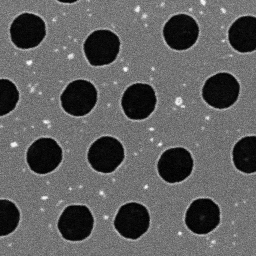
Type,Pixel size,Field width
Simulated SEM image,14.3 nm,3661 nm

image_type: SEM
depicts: a regular array of holes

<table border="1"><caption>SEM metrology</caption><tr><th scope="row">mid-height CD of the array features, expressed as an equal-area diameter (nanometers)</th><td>521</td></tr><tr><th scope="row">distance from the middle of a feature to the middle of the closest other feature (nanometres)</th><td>844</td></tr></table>